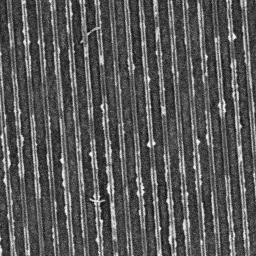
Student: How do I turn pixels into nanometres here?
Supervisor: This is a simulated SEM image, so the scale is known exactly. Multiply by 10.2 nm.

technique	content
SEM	parallel lines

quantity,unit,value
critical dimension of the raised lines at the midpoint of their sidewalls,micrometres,0.0444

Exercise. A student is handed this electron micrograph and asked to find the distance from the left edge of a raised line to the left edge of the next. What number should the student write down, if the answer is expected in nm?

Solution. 149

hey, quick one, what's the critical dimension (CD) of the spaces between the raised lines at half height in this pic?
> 105 nanometers